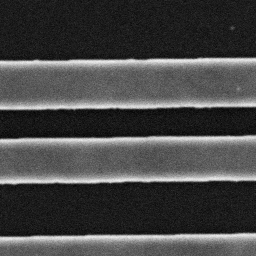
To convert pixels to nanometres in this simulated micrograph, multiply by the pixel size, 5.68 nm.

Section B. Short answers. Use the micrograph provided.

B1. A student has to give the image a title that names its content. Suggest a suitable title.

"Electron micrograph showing lines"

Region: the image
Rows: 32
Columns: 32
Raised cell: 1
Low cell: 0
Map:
00000000000000000000000000000000
00000000000000000000000000000000
00000000000000000000000000000000
00000000000000000000000000000000
00000000000000000000000000000000
00000000000000000000000000000000
00000000000000000000000000000000
00000000000000000001111111111111
11111111111111111111111111111111
11111111111111111111111111111111
11111111111111111111111111111111
11111111111111111111111111111111
11111111111111111111111111111111
11111111111111011110000000000000
00000000000000000000000000000000
00000000000000000000000000000000
00000000000000000000000000000000
11111111111111111111111111111111
11111111111111111111111111111111
11111111111111111111111111111111
11111111111111111111111111111111
11111111111111111111111111111111
11111111111111111111111111000100
00000000000000000000000000000000
00000000000000000000000000000000
00000000000000000000000000000000
00000000000000000000000000000000
00000000000000000000000000000000
00000000000000000000000000000000
00000000000000011111111111111111
11111111111111111111111111111111
11111111111111111111111111111111